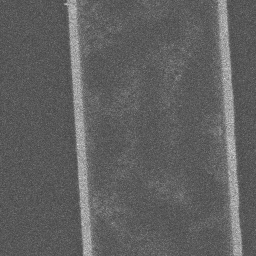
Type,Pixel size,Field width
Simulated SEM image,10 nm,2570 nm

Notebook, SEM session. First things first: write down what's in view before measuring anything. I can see one or a few lines or trenches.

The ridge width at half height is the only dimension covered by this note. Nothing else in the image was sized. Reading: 1530 nm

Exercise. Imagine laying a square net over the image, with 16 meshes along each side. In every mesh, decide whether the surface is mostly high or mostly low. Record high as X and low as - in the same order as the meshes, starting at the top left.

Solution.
----XXXXXXXXXX--
-----XXXXXXXXX--
-----XXXXXXXXX--
-----XXXXXXXXX--
-----XXXXXXXXX--
-----XXXXXXXXX--
-----XXXXXXXXX--
-----XXXXXXXXX--
-----XXXXXXXXX--
-----XXXXXXXXXX-
-----XXXXXXXXXX-
-----XXXXXXXXXX-
-----XXXXXXXXXX-
-----XXXXXXXXXX-
-----XXXXXXXXXX-
-----XXXXXXXXXX-